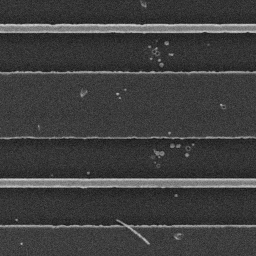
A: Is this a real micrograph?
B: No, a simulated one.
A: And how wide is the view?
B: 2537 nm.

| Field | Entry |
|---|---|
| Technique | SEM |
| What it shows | lines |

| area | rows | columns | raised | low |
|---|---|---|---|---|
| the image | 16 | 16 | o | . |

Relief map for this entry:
................
................
................
................
.ooooooo.oo.o.oo
oooooooooooooooo
oooooooooooooooo
oooooooooooooooo
oooooooooooooooo
................
................
..........o.....
................
................
oooooooooooooooo
oooooooooooooooo